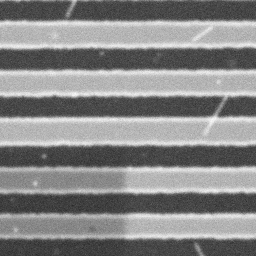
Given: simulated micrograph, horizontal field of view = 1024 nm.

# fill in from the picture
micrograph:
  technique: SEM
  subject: lines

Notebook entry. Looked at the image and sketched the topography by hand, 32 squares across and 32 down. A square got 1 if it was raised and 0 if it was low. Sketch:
00000000000000000000000000000000
00000000000000000000000000000000
00000000000000000000000000000000
11111111111111111111111111111111
11111111111111111111111111111111
11111111111111111111111111111111
00000000000000000000000000000000
00000000000000000000000000000000
00000000000000000000000000000000
11111111111111111111111111111111
11111111111111111111111111111111
11111111111111111111111111111111
00000000000000000000000000000000
00000000000000000000000000000000
00000000000000000000000000000000
11111111111111111111111111111111
11111111111111111111111111111111
11111111111111111111111111111111
00000000000000000000000000000000
00000000000000000000000000000000
00000000000000000000000000000000
11111111111111111111111111111111
11111111111111111111111111111111
11111111111111111111111111111111
00000000000000000000000000000000
00000000000000000000000000000000
00000000000000000000000000000000
11111111111111111111111111111111
11111111111111111111111111111111
11111111111111111111111111111111
00000000000000000000000000000000
00000000000000000000000000000000